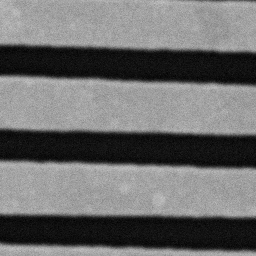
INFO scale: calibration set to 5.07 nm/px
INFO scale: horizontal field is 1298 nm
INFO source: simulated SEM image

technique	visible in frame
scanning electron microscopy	lines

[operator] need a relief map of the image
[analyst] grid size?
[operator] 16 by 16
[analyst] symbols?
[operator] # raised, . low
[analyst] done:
################
################
################
................
................
################
################
################
................
................
#############...
################
################
............#.##
................
#######.#.......